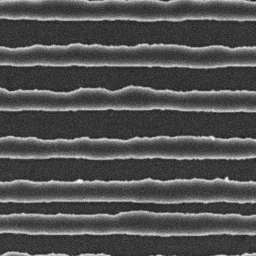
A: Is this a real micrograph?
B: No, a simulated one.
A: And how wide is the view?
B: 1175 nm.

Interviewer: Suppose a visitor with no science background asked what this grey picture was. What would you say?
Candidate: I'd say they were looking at lines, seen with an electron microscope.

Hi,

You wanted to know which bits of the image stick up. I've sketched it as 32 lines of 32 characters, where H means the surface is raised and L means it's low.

HHHHHHHHHHHHHHHHHHHHHHHHHHHHHHHH
HHHHHHHHHHHHHHHHHHHHHHHHHHHHHHHH
LLLLLLLLLLLLLLLLLHHHLHHLLLLLLHHL
LLLLLLLLLLLLLLLLLLLLLLLLLLLLLLLL
LLLLLLLLLLLLLLLLLLLLLLLLLLLLLLLL
LLLLLLLLLLLLLLLLLLLLLLLLLLLLLLLL
HHHHHHHHHHHHHHHHHHHHHHHHHHHHHHHH
HHHHHHHHHHHHHHHHHHHHHHHHHHHHHHHH
LLLLLLLLLLLLLLLLLLLLLLLLLLLLLLLL
LLLLLLLLLLLLLLLLLLLLLLLLLLLLLLLL
LLLLLLLLLLLLLLLLLLLLLLLLLLLLLLLL
HHHHHHHLHHHHHHHHHHHHHHHHHHHHHHHH
HHHHHHHHHHHHHHHHHHHHHHHHHHHHHHHH
HHHHHHHHHHHHHHHHHHHHHHHHHHHHHHHH
LLLLLLLLLLLLLLLLLLLLLLLLLLLLLLLL
LLLLLLLLLLLLLLLLLLLLLLLLLLLLLLLL
LLLLLLLLLLLLLLLLLLLLLLLLLLLLLLLL
HHHHHHLHHHHHHHHLHHHHHHHHHHHHHHHH
HHHHHHHHHHHHHHHHHHHHHHHHHHHHHHHH
HHHHHHHHHHHHHHHHHHHHHHHHHHHHHHHH
LLLLLLLLLLLLLLLLLLLLLLLLLLLLLLLL
LLLLLLLLLLLLLLLLLLLLLLLLLLLLLLLL
LLLLLLLLLLLLLLLLLLHLLLHHHHHHHLLL
HHHHHHHHHHHHHHHHHHHHHHHHHHHHHHHH
HHHHHHHHHHHHHHHHHHHHHHHHHHHHHHHH
LLLLLLLLLLLLLLLLLLLLLLLLLLLLLLLL
LLLLLLLLLLLLLLLLHHHLLLLLLLLLLLLL
HHHHHHHHHHHHHHHHHHHHHHHHHHHHHHHH
HHHHHHHHHHHHHHHHHHHHHHHHHHHHHHHH
LLLLLLLLLLLLLLLLLLLLLLLLLLLLLLLL
LLLLLLLLLLLLLLLLLLLLLLLLLLLLLLLL
LLLLLLLLLLLLLLLLLLLLLLLLLLLLLLLL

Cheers